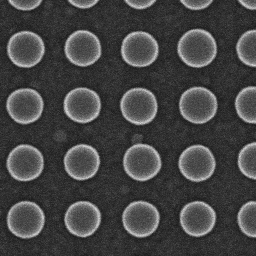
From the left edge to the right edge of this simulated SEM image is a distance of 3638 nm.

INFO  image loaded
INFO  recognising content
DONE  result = a regular array of raised bodies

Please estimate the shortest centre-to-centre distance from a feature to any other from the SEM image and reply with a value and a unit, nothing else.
803 nanometers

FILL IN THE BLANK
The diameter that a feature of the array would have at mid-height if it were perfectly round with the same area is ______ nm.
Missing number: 504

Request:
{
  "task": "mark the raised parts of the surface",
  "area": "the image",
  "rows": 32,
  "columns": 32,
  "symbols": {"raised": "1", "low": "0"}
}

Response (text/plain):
00111000011100001110000111000011
00000000000000000000000000000000
00000000000000000000000000000000
00000000000000000000000000000000
00111000011100001110000111000011
01111000111100011111001111100011
01111000111100011111001111100011
01111000011100001110000111000011
00000000000000000000000000000000
00000000000000000000000000000000
00000000000000000000000000000000
00110000011100001110000111000011
01111000111100011110000111100011
01111000111100011111001111100011
01111000011100001110000111100011
00000000000000000000000000000000
00000000000000000000000000000000
00000000000000000000000000000000
00110000011000001110000011000001
01111000111100001111000111100011
01111000111100001111001111100011
01111000111100001111000111100011
00000000000000000000000010000000
00000000000000000000000000000000
00000000000000000000000000000000
00110000011000001110000011000001
01111000111100001111000111100011
01111000111100011111000111100011
01111000011100001110000111000011
00110000001000000000000000000001
00000000000000000000000000000000
00000000000000000000000000000000